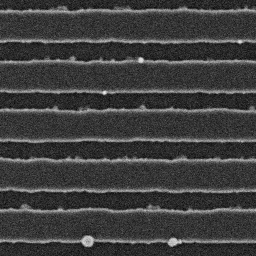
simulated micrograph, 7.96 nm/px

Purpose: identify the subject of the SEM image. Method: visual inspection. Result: lines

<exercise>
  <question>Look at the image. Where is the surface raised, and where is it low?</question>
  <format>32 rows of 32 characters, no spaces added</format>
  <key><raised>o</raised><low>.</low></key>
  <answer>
................................
oooooooooooooooooooooooooooooooo
oooooooooooooooooooooooooooooooo
oooooooooooooooooooooooooooooooo
oooooooooooooooooooooooooooooooo
................................
................................
.......o.........o...........o..
oooooooooooooooooooooooooooooooo
oooooooooooooooooooooooooooooooo
oooooooooooooooooooooooooooooooo
oooooooooooooooooooooooooooooooo
................................
................................
oooooooooooooooooooooooooooooooo
oooooooooooooooooooooooooooooooo
oooooooooooooooooooooooooooooooo
oooooooooooooooooooooooooooooooo
................................
................................
oooooooooooooooooooooooooooooooo
oooooooooooooooooooooooooooooooo
oooooooooooooooooooooooooooooooo
oooooooooooooooooooooooooooooooo
................................
................................
oooooooooooooooooooooooooooooooo
oooooooooooooooooooooooooooooooo
oooooooooooooooooooooooooooooooo
oooooooooooooooooooooooooooooooo
..........oo.........o..........
................................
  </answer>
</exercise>